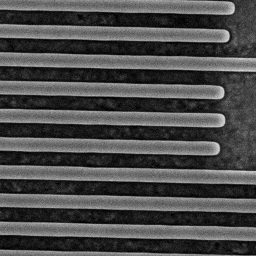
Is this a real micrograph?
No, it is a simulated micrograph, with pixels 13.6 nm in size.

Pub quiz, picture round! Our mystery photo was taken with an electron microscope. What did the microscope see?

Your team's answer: groups of lines, slits or small figures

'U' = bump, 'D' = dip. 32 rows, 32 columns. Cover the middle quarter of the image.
UUUUUUUUUUUUUUUUUUUUUUUUUUUUUUUU
DDDDDDDDDDDDDDDDDDDDDDDDDDDDDDDD
DDDDDDDDDDDDDDDDDDDDDDDDDDDDDDDD
DDDDDDDDDDDDDDDDDDDDDDDDDDDDDDDD
DDDDDDDDDDDDDDDDDDDDDDDDDDDDDDDD
UUUUUUUUUUUUUUUUUUUUUUUUUUUUUUUU
UUUUUUUUUUUUUUUUUUUUUUUUUUUUUUUU
UUUUUUUUUUUUUUUUUUUUUUUUUUUUUUUU
DDDDDDDDDDDDDDDDDDDDDDDDDDDDDDDD
DDDDDDDDDDDDDDDDDDDDDDDDDDDDDDDD
DDDDDDDDDDDDDDDDDDDDDDDDDDDDDDDD
DDDDDDDDDDDDDDDDDDDDDDDDDDDDDDDD
UUUUUUUUUUUUUUUUUUUUUUUUUUUUUUUU
UUUUUUUUUUUUUUUUUUUUUUUUUUUUUUUU
UUUUUUUUUUUUUUUUUUUUUUUUUUUUUUUU
DDDDDDDDDDDDDDDDDDDDDDDDDDDDDDDU
DDDDDDDDDDDDDDDDDDDDDDDDDDDDDDDD
DDDDDDDDDDDDDDDDDDDDDDDDDDDDDDDD
DDDDDDDDDDDDDDDDDDDDDDDDDDDDDDDD
UUUUUUUUUUUUUUUUUUUUUUUUUUUUUUUU
UUUUUUUUUUUUUUUUUUUUUUUUUUUUUUUU
UUUUUUUUUUUUUUUUUUUUUUUUUUUUUUUU
DDDDDDDDDDDDDDDDDDDDDDDDDDDDUUUU
DDDDDDDDDDDDDDDDDDDDDDDDDDDDDDDD
DDDDDDDDDDDDDDDDDDDDDDDDDDDDDDDD
DDDDDDDDDDDDDDDDDDDDDDDDDDDDDDDD
UUUUUUUUUUUUUUUUUUUUUUUUUUUUUDDD
UUUUUUUUUUUUUUUUUUUUUUUUUUUUUUUU
UUUUUUUUUUUUUUUUUUUUUUUUUUUUUUUU
DDDDDDDDDDDDDDDDDDDDDDDDDDUUUUUU
DDDDDDDDDDDDDDDDDDDDDDDDDDDDDDDD
DDDDDDDDDDDDDDDDDDDDDDDDDDDDDDDD